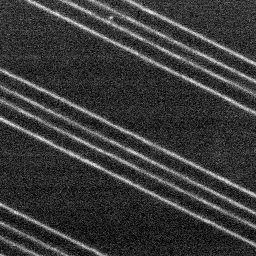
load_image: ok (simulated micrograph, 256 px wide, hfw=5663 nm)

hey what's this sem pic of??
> lines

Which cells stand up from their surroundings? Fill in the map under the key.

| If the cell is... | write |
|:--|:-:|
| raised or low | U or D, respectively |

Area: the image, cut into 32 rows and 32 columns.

UUUUUDDDDUUUUDDDDUUUUUUUUUUUUUUU
UUUUUUUDDDDUUUDDDDDUUUUUUUUUUUUU
UUUUUUUUUDDDDUUUUDDDDUUUUUUUUUUU
UUUUUUUUUUUDDDDUUUDDDDDUUUUUUUUU
UUUUUUUUUUUUUDDDDUUUUDDDDUUUUUUU
UUUUUUUUUUUUUUUDDDDUUUUDDDDUUUUU
UUUUUUUUUUUUUUUUUDDDDUUUUDDDDUUU
UUUUUUUUUUUUUUUUUUUDDDDUUUUDDDDU
UUUUUUUUUUUUUUUUUUUUUDDDDUUUUDDD
DDUUUUUUUUUUUUUUUUUUUUUDDDDUUUUD
DDDDUUUUUUUUUUUUUUUUUUUUUDDDDUUU
UUDDDDUUUUUUUUUUUUUUUUUUUUUDDDDU
UUUUDDDDUUUUUUUUUUUUUUUUUUUUUDDD
DDUUUUDDDDUUUUUUUUUUUUUUUUUUUUUD
DDDDUUUUDDDDUUUUUUUUUUUUUUUUUUUU
UDDDDDUUUUDDDDUUUUUUUUUUUUUUUUUU
UUUUDDDDUUUUDDDDUUUUUUUUUUUUUUUU
UUUUUUDDDDUUUUDDDDUUUUUUUUUUUUUU
UUUUUUUUDDDDUUUUDDDDUUUUUUUUUUUU
UUUUUUUUUDDDDDUUUUDDDDUUUUUUUUUU
UUUUUUUUUUUUDDDDUUUUDDDDUUUUUUUU
UUUUUUUUUUUUUUDDDDUUUUDDDDUUUUUU
UUUUUUUUUUUUUUUUDDDDUUUUDDDDUUUU
UUUUUUUUUUUUUUUUUUDDDDUUUUDDDDUU
UUUUUUUUUUUUUUUUUUUUDDDDUUUUDDDD
UUUUUUUUUUUUUUUUUUUUUUDDDDUUUUDD
DDUUUUUUUUUUUUUUUUUUUUUUDDDDUUUU
DDDDUUUUUUUUUUUUUUUUUUUUUUDDDDUU
UDDDDDUUUUUUUUUUUUUUUUUUUUUUDDDD
UUUUDDDDUUUUUUUUUUUUUUUUUUUUUUDD
DDUUUDDDDDUUUUUUUUUUUUUUUUUUUUUU
DDDDUUUDDDDDUUUUUUUUUUUUUUUUUUUU